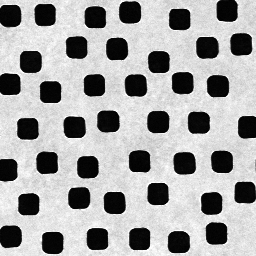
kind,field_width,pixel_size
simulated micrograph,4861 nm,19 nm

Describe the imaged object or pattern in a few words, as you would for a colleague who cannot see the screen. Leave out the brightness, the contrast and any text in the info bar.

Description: a regular array of holes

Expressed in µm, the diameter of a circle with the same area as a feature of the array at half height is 0.453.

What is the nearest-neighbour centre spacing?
0.691 µm